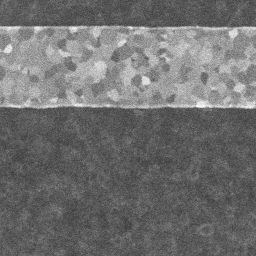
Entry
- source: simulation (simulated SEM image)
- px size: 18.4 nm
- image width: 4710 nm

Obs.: one or a few lines or trenches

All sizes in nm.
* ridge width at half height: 1440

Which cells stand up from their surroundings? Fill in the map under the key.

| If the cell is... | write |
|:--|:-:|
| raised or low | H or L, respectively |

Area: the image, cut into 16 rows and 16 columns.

LLLLLLLLLLLLLLLL
LLLLLLLLLLLLLLLL
HHHHHHHHHHHHHHHH
HHHHHHHHHHHHHHHH
HHHHHHHHHHHHHHHH
HHHHHHHHHHHHHHHH
HHHHHHHHHHHHHHHH
LLLLLLLLLLLLLLLL
LLLLLLLLLLLLLLLL
LLLLLLLLLLLLLLLL
LLLLLLLLLLLLLLLL
LLLLLLLLLLLLLLLL
LLLLLLLLLLLLLLLL
LLLLLLLLLLLLLLLL
LLLLLLLLLLLLLLLL
LLLLLLLLLLLLLLLL